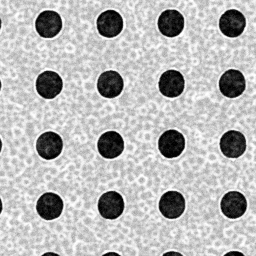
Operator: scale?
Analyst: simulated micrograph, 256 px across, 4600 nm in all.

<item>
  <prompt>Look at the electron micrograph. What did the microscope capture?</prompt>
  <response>a regular array of holes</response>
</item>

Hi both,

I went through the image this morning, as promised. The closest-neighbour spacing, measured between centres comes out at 1090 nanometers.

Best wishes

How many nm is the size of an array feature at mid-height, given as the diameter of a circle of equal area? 510